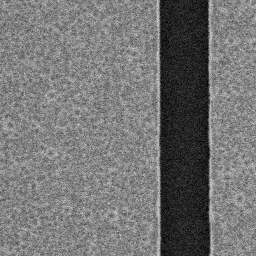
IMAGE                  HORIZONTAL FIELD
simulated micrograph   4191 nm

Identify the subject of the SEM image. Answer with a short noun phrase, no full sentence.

one or a few lines or trenches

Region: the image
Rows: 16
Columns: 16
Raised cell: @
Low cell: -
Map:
@@@@@@@@@@---@@@
@@@@@@@@@@---@@@
@@@@@@@@@@---@@@
@@@@@@@@@@---@@@
@@@@@@@@@@---@@@
@@@@@@@@@@---@@@
@@@@@@@@@@---@@@
@@@@@@@@@@---@@@
@@@@@@@@@@---@@@
@@@@@@@@@@---@@@
@@@@@@@@@@---@@@
@@@@@@@@@@---@@@
@@@@@@@@@@---@@@
@@@@@@@@@@---@@@
@@@@@@@@@@---@@@
@@@@@@@@@@---@@@